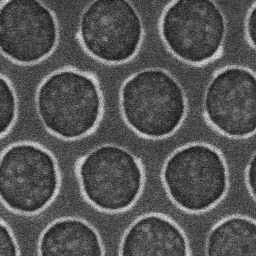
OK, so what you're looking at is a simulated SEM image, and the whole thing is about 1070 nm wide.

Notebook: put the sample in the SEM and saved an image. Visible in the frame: holes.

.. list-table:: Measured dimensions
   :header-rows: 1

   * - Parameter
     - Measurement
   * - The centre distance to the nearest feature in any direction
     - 353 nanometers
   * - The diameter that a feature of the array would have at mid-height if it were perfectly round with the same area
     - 259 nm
